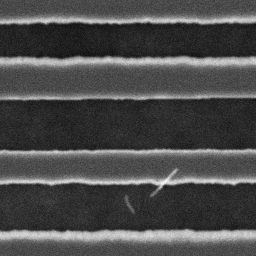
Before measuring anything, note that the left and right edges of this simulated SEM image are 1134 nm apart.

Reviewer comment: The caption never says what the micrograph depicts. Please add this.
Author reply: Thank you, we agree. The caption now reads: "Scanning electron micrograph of lines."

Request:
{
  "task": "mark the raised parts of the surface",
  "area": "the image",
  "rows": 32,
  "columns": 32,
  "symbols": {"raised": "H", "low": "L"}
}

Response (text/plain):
HHHHHHHHHHHHHHHHHHHHHHHHHHHHHHHH
HHHHHHHHHHHHHHHHHHHHHHHHHHHHHHHH
HHHHHHHHHHHHHHHHHHHHHHHHHHHHHHHH
LLLLLLLLLLLLLLLLLLLLLLLLLLLLLLLL
LLLLLLLLLLLLLLLLLLLLLLLLLLLLLLLL
LLLLLLLLLLLLLLLLLLLLLLLLLLLLLLLL
LLLLLLLLLLLLLLLLLLLLLLLLLLLLLLLL
HHHHHHHLHHHHHHHHHHHHHHHHHHHHHHHH
HHHHHHHHHHHHHHHHHHHHHHHHHHHHHHHH
HHHHHHHHHHHHHHHHHHHHHHHHHHHHHHHH
HHHHHHHHHHHHHHHHHHHHHHHHHHHHHHHH
HHHHHHHHHHHHHHHHHHHHHHHHHHHHHHHH
LLLHLLLLLLLLLLLLLLLLLLLLLLLLLLLL
LLLLLLLLLLLLLLLLLLLLLLLLLLLLLLLL
LLLLLLLLLLLLLLLLLLLLLLLLLLLLLLLL
LLLLLLLLLLLLLLLLLLLLLLLLLLLLLLLL
LLLLLLLLLLLLLLLLLLLLLLLLLLLLLLLL
LLLLLLLLLLLLLLLLLLLLLLLLLLLLLLLL
LLLLLLLLLLLLLLLLLLLLLLLLLLLLLLLL
HHHHHHHHHHHHHHHHHHHHHHHHHHHHHHHH
HHHHHHHHHHHHHHHHHHHHHHHHHHHHHHHH
HHHHHHHHHHHHHHHHHHHHHHHHHHHHHHHH
HHHHHHHHHHHHHHHHHHHHHHHHHHHHHHHH
LLLLLLLLLLLLLLLLLLLLLLLLLLLLLLLL
LLLLLLLLLLLLLLLLLLLLLLLLLLLLLLLL
LLLLLLLLLLLLLLLLLLLLLLLLLLLLLLLL
LLLLLLLLLLLLLLLLLLLLLLLLLLLLLLLL
LLLLLLLLLLLLLLLLLLLLLLLLLLLLLLLL
LLLLLLLLLLLLLLLLLLLLLLLLLLLLLLLL
HHHHHHHHHHHHHHHHHHHHHHHHHHHHHHHH
HHHHHHHHHHHHHHHHHHHHHHHHHHHHHHHH
HHHHHHHHHHHHHHHHHHHHHHHHHHHHHHHH